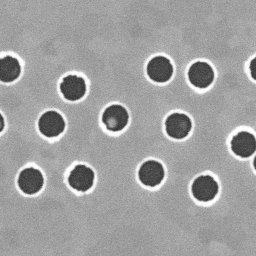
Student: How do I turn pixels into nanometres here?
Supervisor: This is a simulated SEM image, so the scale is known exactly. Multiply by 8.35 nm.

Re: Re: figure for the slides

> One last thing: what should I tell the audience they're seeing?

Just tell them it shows a regular array of holes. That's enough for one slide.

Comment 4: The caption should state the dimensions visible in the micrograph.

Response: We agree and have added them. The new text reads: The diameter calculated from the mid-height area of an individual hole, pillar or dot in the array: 231 nm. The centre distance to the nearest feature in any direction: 0.428 um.